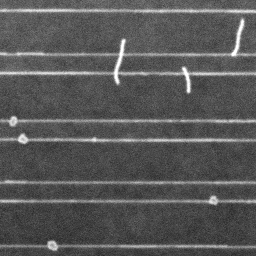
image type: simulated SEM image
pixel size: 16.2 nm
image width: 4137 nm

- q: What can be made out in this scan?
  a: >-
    lines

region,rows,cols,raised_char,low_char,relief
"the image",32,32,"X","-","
XXXXXXXXXXXXXXXXXXXXXXXXXXXXXXXX
--------------------------------
--------------------------------
--------------------------------
--------------------------------
--------------------------------
--------------------------------
XXXXXXXXXXXXXXXXXXXXXXXXXXXXXXXX
XXXXXXXXXXXXXXXXXXXXXXXXXXXXXXXX
--------------------------------
--------------------------------
--------------------------------
--------------------------------
--------------------------------
--------------------------------
XXXXXXXXXXXXXXXXXXXXXXXXXXXXXXXX
XXXXXXXXXXXXXXXXXXXXXXXXXXXXXXXX
--XX-------XXXXXXXXXXXXXXX-XXXXX
--------------------------------
--------------------------------
--------------------------------
--------------------------------
--------------------------------
XXXXXXXXXXXXXXXXXXXXXXXXXXXXXXXX
XXXXXXXXXXXXXXXXXXXXXXXXXXXXXXXX
--------------------------------
--------------------------------
--------------------------------
--------------------------------
--------------------------------
------X-------------------------
XXXXXXXXXXXXXXXXXXXXXXXXXXXXXXXX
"